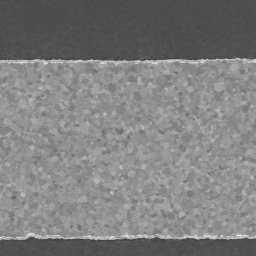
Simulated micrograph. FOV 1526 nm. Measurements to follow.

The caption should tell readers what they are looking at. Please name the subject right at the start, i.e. one or a few lines or trenches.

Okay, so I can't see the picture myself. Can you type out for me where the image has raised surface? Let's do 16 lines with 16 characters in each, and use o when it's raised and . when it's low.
................
................
................
................
oooooooooooooooo
oooooooooooooooo
oooooooooooooooo
oooooooooooooooo
oooooooooooooooo
oooooooooooooooo
oooooooooooooooo
oooooooooooooooo
oooooooooooooooo
oooooooooooooooo
oooooooooooooooo
................